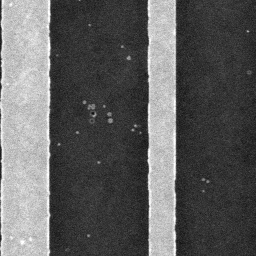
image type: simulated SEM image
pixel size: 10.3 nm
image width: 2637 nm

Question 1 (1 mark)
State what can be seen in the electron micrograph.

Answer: lines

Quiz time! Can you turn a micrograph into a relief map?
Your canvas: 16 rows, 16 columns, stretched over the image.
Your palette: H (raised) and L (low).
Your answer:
HHHLLLLLLHHLLLLL
HHHLLLLLLHHLLLLL
HHHLLLLLLHHLLLLL
HHHLLLLLLHHLLLLL
HHHLLLLLLHHLLLLL
HHHLLLLLLHHLLLLL
HHHLLLLLLHHLLLLL
HHHLLLLLLHHLLLLL
HHHLLLLLLHHLLLLL
HHHLLLLLLHHLLLLL
HHHLLLLLLHHLLLLL
HHHLLLLLLHHLLLLL
HHHLLLLLLHHLLLLL
HHHLLLLLLHHLLLLL
HHHLLLLLLHHLLLLL
HHHLLLLLLHHLLLLL